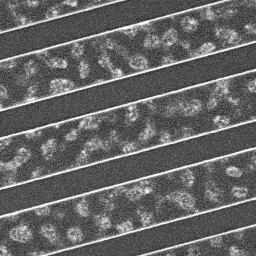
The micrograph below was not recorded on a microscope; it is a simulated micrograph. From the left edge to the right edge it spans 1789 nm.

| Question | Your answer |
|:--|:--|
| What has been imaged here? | one or a few lines or trenches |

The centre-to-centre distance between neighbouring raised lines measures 526 nanometres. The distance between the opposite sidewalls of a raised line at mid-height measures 345 nanometers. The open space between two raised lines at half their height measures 0.185 µm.